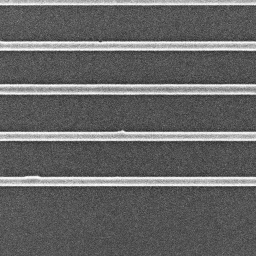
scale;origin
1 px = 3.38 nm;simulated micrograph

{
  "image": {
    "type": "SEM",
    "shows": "parallel lines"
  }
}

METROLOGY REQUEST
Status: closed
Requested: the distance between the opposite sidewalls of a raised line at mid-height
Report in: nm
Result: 28.7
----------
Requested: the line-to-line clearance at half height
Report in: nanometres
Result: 125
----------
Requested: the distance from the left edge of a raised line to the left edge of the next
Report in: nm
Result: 153